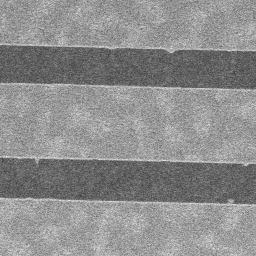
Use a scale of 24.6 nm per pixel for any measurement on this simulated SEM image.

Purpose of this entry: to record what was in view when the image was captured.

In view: one or a few lines or trenches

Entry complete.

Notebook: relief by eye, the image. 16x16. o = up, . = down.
oooooooooooooooo
oooooooooooooooo
oooooooooooooooo
................
................
oooooooooo......
oooooooooooooooo
oooooooooooooooo
oooooooooooooooo
oooooooooooooooo
................
................
oooo............
oooooooooooooooo
oooooooooooooooo
oooooooooooooooo